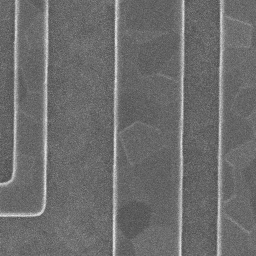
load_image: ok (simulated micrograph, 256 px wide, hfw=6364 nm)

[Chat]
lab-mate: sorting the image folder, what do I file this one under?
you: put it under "wiring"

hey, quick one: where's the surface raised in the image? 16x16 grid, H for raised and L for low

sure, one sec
LHHLLLLHHHHLLLHH
LHHLLLLHHHHLLLHH
LHHLLLLHHHHLLLHH
LHHLLLLHHHHLLLHH
LHHLLLLHHHHLLLHH
LHHLLLLHHHHLLLHH
LHHLLLLHHHHLLLHH
LHHLLLLHHHHLLLHH
LHHLLLLHHHHLLLHH
LHHLLLLHHHHLLLHH
LHHLLLLHHHHLLLHH
HHHLLLLHHHHLLLHH
HHHLLLLHHHHLLLHH
LLLLLLLHHHHLLLHH
LLLLLLLHHHHLLLHH
LLLLLLLHHHHLLLHH